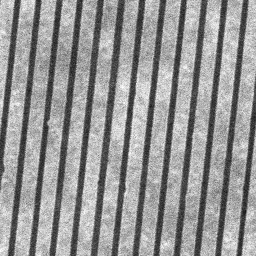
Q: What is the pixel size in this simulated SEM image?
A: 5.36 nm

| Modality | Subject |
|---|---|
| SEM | parallel lines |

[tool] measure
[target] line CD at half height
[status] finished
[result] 0.0758 micrometres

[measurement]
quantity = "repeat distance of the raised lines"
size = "0.11 µm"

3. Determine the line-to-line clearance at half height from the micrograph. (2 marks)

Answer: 0.0353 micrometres